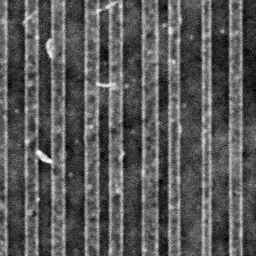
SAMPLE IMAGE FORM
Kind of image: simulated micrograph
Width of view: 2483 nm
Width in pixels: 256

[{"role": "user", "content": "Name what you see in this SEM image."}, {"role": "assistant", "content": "parallel lines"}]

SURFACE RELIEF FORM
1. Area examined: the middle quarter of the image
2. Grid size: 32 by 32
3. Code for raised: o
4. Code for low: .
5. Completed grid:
......ooo...oo......ooo...ooo...
......ooo...oo......ooo...ooo...
......ooo...oo......ooo...ooo...
.....oooo...oo......ooo...ooo...
.....oooo...oo......ooo...ooo...
.....oooo..ooo......ooo...ooo...
......ooo...oo......ooo...ooo...
.....oooo...oo......ooo...ooo...
.....oooo...oo......ooo...ooo...
.....oooo...oo......ooo...ooo...
.....oooo...oo......ooo...ooo...
.....oooo...oo......ooo...ooo...
.....oooo...oo......ooo...ooo...
.....oooo...oo......ooo...ooo...
.....oooo...oo......ooo...ooo...
.....oooo...oo......ooo...ooo...
.....oooo...oo......ooo...ooo...
.....ooo....oo......ooo...ooo...
.....oooo...oo......ooo...ooo...
.....oooo...oo......ooo...ooo...
.....oooo...oo......ooo...ooo...
.....oooo...oo......ooo...ooo...
.....oooo...ooo.....ooo...ooo...
.....oooo...oo......ooo...ooo...
.....oooo...oo......ooo...ooo...
.....oooo...oo......ooo...ooo...
.....oooo...oo......ooo...ooo...
.....oooo...ooo.....ooo...ooo...
.....oooo...ooo.....ooo...ooo...
.....oooo...ooo.....ooo...ooo...
......ooo...ooo.....ooo...ooo...
......ooo...ooo.....ooo...ooo...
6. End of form